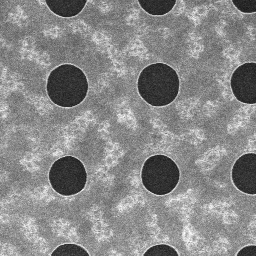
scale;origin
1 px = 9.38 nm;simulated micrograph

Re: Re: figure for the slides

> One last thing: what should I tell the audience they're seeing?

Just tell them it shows holes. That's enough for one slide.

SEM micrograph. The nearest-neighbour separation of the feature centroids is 846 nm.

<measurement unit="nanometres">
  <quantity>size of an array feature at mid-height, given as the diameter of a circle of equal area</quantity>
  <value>383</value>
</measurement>